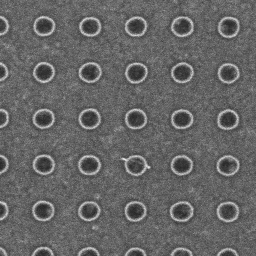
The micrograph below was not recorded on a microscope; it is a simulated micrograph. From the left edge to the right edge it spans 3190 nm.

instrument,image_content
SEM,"a regular array of raised bodies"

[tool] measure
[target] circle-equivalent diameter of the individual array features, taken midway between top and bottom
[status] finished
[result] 249 nm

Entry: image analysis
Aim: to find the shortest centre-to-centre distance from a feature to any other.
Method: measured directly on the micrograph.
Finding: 569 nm